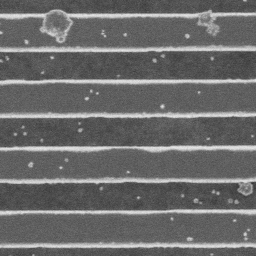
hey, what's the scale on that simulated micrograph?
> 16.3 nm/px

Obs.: lines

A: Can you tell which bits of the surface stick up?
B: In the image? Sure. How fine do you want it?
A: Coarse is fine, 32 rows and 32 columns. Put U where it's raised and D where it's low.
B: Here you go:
DDDDDDDDDDDDDDDDDDDDDDDDDDDDDDDD
DDDDDDUUDDDDDDDDDDDDDDDDDDDDDDDD
UUUUUUUUUUUUUUUUUUUUUUUUUUUUUUUU
UUUUUUUUUUUUUUUUUUUUUUUUUUUUUUUU
UUUUUUUUUUUUUUUUUUUUUUUUUUUUUUUU
UUUUUUUUUUUUUUUUUUUUUUUUUUUUUUUU
DDDDDDDDDDDDDDDDDDDDDDDDDDDDDDDD
DDDDDDDDDDDDDDDDDDDDDDDDDDDDDDDD
DDDDDDDDDDDDDDDDDDDDDDDDDDDDDDDD
DDDDDDDDDDDDDDDDDDDDDDDDDDDDDDDD
UUUUUUUUUUUUUUUUUUUUUUUUUUUUUUUU
UUUUUUUUUUUUUUUUUUUUUUUUUUUUUUUU
UUUUUUUUUUUUUUUUUUUUUUUUUUUUUUUU
UUUUUUUUUUUUUUUUUUUUUUUUUUUUUUUU
UUUUUUUUUUUUUUUUUUUUUUUUUUUUDDDD
DDDDDDDDDDDDDDDDDDDDDDDDDDDDDDDD
DDDDDDDDDDDDDDDDDDDDDDDDDDDDDDDD
DDDDDDDDDDDDDDDDDDDDDDDDDDDDDDDD
DDDDDDDDDDDDDUUUUUUDDUUUUUUUUUUU
UUUUUUUUUUUUUUUUUUUUUUUUUUUUUUUU
UUUUUUUUUUUUUUUUUUUUUUUUUUUUUUUU
UUUUUUUUUUUUUUUUUUUUUUUUUUUUUUUU
UUUUUUUUUUUUUUUUUUUUUUUUUUUUUUUU
DDDDDDDDDDDDDDDDDDDDDDDDDDDDDDUD
DDDDDDDDDDDDDDDDDDDDDDDDDDDDDDDD
DDDDDDDDDDDDDDDDDDDDDDDDDDDDDDDD
DDDDUDDDDDDDDUUDDDUUUUUUUUUUUUUU
UUUUUUUUUUUUUUUUUUUUUUUUUUUUUUUU
UUUUUUUUUUUUUUUUUUUUUUUUUUUUUUUU
UUUUUUUUUUUUUUUUUUUUUUUUUUUUUUUU
UUUUUUUUUUUUUUUUUUUUUUUUUUUUUUUU
DDDDDDDDDDDDDDDDDDDDDDDDDDDDDDDD